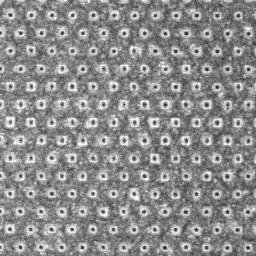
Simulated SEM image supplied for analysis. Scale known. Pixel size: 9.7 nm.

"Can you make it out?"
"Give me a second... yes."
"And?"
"holes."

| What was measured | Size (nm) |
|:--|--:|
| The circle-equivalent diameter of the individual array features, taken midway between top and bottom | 21.9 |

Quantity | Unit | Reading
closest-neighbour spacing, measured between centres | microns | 0.0941